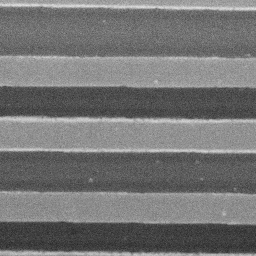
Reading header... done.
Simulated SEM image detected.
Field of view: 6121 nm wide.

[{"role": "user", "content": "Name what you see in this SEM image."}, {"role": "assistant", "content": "lines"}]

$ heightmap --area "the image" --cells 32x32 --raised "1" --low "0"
11111111111111111111111111111111
00000000000000000000000000000000
00000000000000000000000000000000
00000000000000000000000000000000
00000000000000000000000000000000
00000000000000000000000000000000
00000000000000000000000000000000
11111111111111111111111111111111
11111111111111111111111111111111
11111111111111111111111111111111
11111111111111111111111111111111
00000000000000000000000000000000
00000000000000000000000000000000
00000000000000000000000000000000
00000000000000000000000000000000
11111111111111111111111111111111
11111111111111111111111111111111
11111111111111111111111111111111
11111111111111111111111111111111
00000000000000000000000000000000
00000000000000000000000000000000
00000000000000000000000000000000
00000000000000000000000000000000
00000000000000000000000000000000
11111111111111111111111111111111
11111111111111111111111111111111
11111111111111111111111111111111
11111111111111111111111111111111
00000000000000000000000000000000
00000000000000000000000000000000
00000000000000000000000000000000
10010000000000000000000000000000